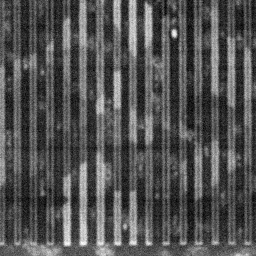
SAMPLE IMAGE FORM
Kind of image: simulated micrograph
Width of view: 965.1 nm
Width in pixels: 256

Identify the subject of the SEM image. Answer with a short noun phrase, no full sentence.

parallel lines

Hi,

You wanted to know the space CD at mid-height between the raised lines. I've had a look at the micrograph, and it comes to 43.3 nm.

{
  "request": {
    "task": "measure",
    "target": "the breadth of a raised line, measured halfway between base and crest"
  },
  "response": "4.75 px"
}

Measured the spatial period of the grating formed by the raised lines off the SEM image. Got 62 nm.